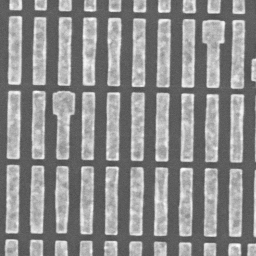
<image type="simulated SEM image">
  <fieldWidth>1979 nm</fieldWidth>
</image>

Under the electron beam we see wiring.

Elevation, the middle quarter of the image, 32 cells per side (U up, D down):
UDDDDUUDDDDUUUDDDUUUDDDUUUDDDDUU
UDDDDUUDDDDUUUDDDUUUDDDUUUDDDDUU
UDDDDUUDDDDUUUDDDUUUDDDDUUDDDDUU
UDDDDUUDDDDUUUDDDUUUDDDUUUDDDDUU
UDDDDUUDDDDUUUDDDUUUDDDUUUDDDDUU
DDDDDDDDDDDDDDDDDUUUDDDUUUDDDDUU
DDDDDDDDDDDDDDDDDDDDDDDDDDDDDDDD
UUDDDUUDDDDUUUDDDUUUDDDUUUDDDDDD
UUDDDUUDDDDUUUDDDUUUDDDUUUDDDUUU
UUDDDUUDDDDUUUDDDUUUDDDUUUDDDUUU
UUDDDUUDDDDUUUDDDUUUDDDUUUDDDUUU
UUDDDUUDDDDUUUDDDUUUDDDUUUDDDDUU
UUDDDUUDDDDUUUDDDUUUDDDUUUDDDDUU
UDDDDUUDDDDUUUDDDUUUDDDUUUDDDUUU
UDDDDUUDDDDUUUDDDUUUDDDUUUDDDUUU
UDDDDUUDDDDUUUDDDUUUDDDUUUDDDUUU
UDDDDUUDDDDUUUDDDUUUDDDUUUDDDDUU
UDDDDUUDDDDUUUDDDUUUDDDUUUDDDDUU
UDDDDUUDDDDUUUDDDUUUDDDUUUDDDDUU
UDDDDUUDDDDUUUDDDUUUDDDUUUDDDDUU
UDDDDUUDDDDUUUDDDUUUDDDUUUDDDUUU
UDDDDUUDDDDUUUDDDUUUDDDUUUDDDUUU
UDDDDUUDDDDUUUDDDUUUDDDUUUDDDUUU
UDDDDUUDDDDUUUDDDUUUDDDUUUDDDUUU
DDDDDDDDDDDDDDDDDDDDDDDDDDDDDDDD
DDDDDDDDDDDDDDDDDDDDDDDDDDDDDDDD
UDDDDUUDDDDUUUDDDUUUDDDUUUDDDUUU
UDDDDUUDDDDUUUDDDUUUDDDUUUDDDUUU
UDDDDUUDDDDUUDDDDUUUDDDUUUDDDUUU
UDDDDUUDDDDUUDDDDUUUDDDUUUDDDUUU
UDDDDUUDDDDUUDDDDUUUDDDUUDDDDUUU
UDDDUUUDDDDUUDDDDUUUDDDUUDDDDUUU